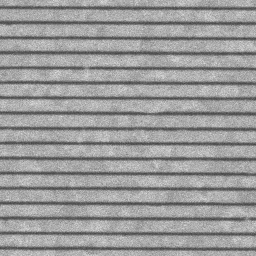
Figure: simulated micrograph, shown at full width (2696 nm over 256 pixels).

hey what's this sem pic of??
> parallel lines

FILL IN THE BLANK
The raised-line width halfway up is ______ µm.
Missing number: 0.117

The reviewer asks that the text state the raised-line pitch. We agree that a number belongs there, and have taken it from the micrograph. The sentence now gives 158 nm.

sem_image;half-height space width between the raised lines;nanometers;44.8